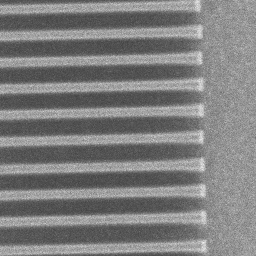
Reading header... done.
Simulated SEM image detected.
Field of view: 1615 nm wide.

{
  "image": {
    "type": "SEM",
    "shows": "parallel lines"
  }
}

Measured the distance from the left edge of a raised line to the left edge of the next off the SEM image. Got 169 nanometres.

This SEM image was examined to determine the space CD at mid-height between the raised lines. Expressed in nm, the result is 100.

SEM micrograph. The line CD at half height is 0.0646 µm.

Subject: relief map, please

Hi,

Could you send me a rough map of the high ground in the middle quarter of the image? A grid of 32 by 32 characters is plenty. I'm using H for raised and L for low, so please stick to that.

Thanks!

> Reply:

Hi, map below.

LLLLLLLLLLLLLLLLLLLLLLLLLLLLLLLL
LLLLLLLLLLLLLLLLLLLLLLLLLLLLLLLL
LLLLLLLLLLLLLLLLLLLLLLLLLLLLLLLL
LLLLLLLLLLLLLLLLLLLLLLLLLLLLLLLL
LLLLLLHHHHHHHHHHHHHHHHHHHHHHHHHH
HHHHHHHHHHHHHHHHHHHHHHHHHHHHHHHH
HHHHHHHHHHHHHHHHHHHHHHHHHHHHHHLL
LLLLLLLLLLLLLLLLLLLLLLLLLLLLLLLL
LLLLLLLLLLLLLLLLLLLLLLLLLLLLLLLL
LLLLLLLLLLLLLLLLLLLLLLLLLLLLLLLL
LLLLLLLLLLLLLLLLLLLLLLLLLLLLHHHH
HHHHHHHHHHHHHHHHHHHHHHHHHHHHHHHH
HHHHHHHHHHHHHHHHHHHHHHHHHHHHHHHH
HHHHHHLLLLLLLLLLLLLLLLLLLLLLLLLL
LLLLLLLLLLLLLLLLLLLLLLLLLLLLLLLL
LLLLLLLLLLLLLLLLLLLLLLLLLLLLLLLL
LLLLLLLLLLLLLLLLLLLLLLLLLLLLLLLL
LLLLLLLLLLLLLLLLLLHHHHLHHHHHHHHH
HHHHHHHHHHHHHHHHHHHHHHHHHHHHHHHH
HHHHHHHHHHHHHHHHHHHHHHHHHHHHHHHH
LLLLLLLLLLLLLLLLLLLLLLLLLLLLLLLL
LLLLLLLLLLLLLLLLLLLLLLLLLLLLLLLL
LLLLLLLLLLLLLLLLLLLLLLLLLLLLLLLL
LLLLLLLLLLLLLLLLLLLLLLLLLLLLLLLL
LLLLLLLLLLLLLLLLLHHHHHHHHHHHHHHH
HHHHHHHHHHHHHHHHHHHHHHHHHHHHHHHH
HHHHHHHHHHHHHHHHHHHHHHHHHHHHHHHL
LLLLLLLLLLLLLLLLLLLLLLLLLLLLLLLL
LLLLLLLLLLLLLLLLLLLLLLLLLLLLLLLL
LLLLLLLLLLLLLLLLLLLLLLLLLLLLLLLL
LLLLLLLLLLLLLLLLLLLLLLLLLLLLLHHH
HHHHHHHHHHHHHHHHHHHHHHHHHHHHHHHH